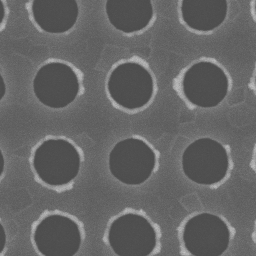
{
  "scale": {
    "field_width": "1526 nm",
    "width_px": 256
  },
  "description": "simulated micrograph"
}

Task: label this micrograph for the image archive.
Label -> holes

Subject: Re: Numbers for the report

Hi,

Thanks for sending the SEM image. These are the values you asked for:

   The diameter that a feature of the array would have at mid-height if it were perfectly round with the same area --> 272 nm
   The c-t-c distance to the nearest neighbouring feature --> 0.446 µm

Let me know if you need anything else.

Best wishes